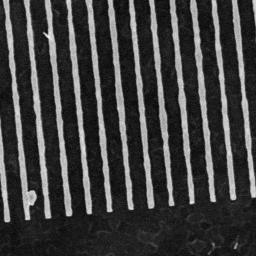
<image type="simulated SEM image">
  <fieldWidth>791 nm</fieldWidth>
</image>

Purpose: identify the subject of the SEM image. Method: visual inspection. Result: parallel lines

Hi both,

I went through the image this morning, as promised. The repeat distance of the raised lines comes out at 63.7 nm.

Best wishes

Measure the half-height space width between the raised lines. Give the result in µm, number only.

0.0488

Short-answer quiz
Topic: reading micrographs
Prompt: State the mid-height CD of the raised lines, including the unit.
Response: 14.6 nm